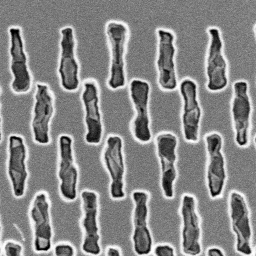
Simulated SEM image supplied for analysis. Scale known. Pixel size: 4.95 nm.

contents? a regular array of holes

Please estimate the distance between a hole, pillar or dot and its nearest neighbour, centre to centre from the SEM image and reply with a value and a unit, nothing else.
244 nm